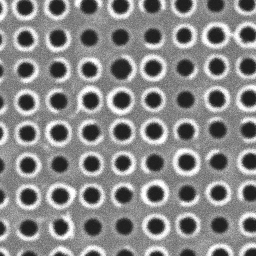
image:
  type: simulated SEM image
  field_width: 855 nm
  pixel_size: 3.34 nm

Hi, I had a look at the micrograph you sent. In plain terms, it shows a regular array of holes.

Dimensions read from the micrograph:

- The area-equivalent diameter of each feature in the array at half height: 17.1 pixels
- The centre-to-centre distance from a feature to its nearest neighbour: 104 nm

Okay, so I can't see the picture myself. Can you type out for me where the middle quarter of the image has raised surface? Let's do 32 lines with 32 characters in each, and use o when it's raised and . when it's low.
oooo....oooo.....ooo....oooo....
.ooo....ooo......ooo....oooo....
ooooo...oooo....ooooo...ooooo...
ooooooooooooo...oooooooooooooooo
oooooooooooooooooooooooooooooooo
oooooooooooooooooooooooooooooooo
oooooooooooooooooooooooooooooooo
ooooo...ooooo...ooooo...ooooo...
.oooo....ooo.....ooo....oooo....
.oooo....ooo.....ooo....oooo....
.oooo...ooooo...ooooo...ooooo...
oooooooooooooooooooooooooooooooo
oooooooooooooooooooooooooooooooo
oooooooooooooooooooooooooooooooo
oooooooooooooooooooooooooooooooo
ooooo...ooooo...ooooo...ooooo...
.oooo....ooo.....ooo.....ooo....
.ooo.....ooo.....ooo.....oooo...
.oooo...ooooo...ooooo...ooooo...
oooooooooooooooooooooooooooooooo
oooooooooooooooooooooooooooooooo
oooooooooooooooooooooooooooooooo
oooooooooooooooooooooooooooooo.o
ooooo...ooooo...ooooo...ooooo...
.oooo....oooo....ooo.....ooo....
.oooo....oooo....oooo....oooo...
.oooo....ooooo..ooooo...oooooo..
oooooooooooooooooooooooooooooooo
oooooooooooooooooooooooooooooooo
oooooooooooooooooooooooooooooooo
oooooooooooooooooooooo.ooooooo..
.oooo....oooo....oooo....oooo...